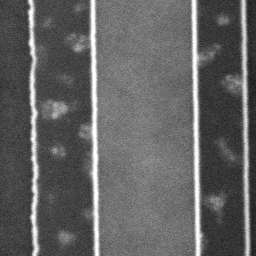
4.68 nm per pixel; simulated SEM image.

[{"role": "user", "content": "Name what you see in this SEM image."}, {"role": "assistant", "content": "one or a few lines or trenches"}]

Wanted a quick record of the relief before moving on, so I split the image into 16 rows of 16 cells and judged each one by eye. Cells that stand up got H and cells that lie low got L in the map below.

LLHHHHLLLLLLHHHL
LLHHHHLLLLLLHHHL
LLHHHHLLLLLLHHHL
LLHHHHLLLLLLHHHL
LLHHHHLLLLLLHHHL
LLHHHHLLLLLLHHHL
LLHHHHLLLLLLHHHL
LLHHHHLLLLLLHHHL
LLHHHHLLLLLLHHHL
LLHHHHLLLLLLHHHL
LLHHHHLLLLLLHHHL
LLHHHHLLLLLLHHHL
LLHHHHLLLLLLHHHL
LLHHHHLLLLLLHHHL
LLHHHHLLLLLLHHHL
LLHHHHLLLLLLHHHL